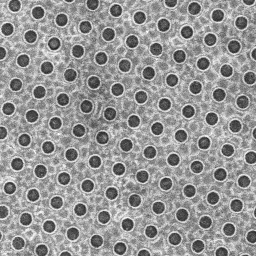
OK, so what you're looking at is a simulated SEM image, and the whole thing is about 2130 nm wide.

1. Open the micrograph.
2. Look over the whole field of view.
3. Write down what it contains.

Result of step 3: a regular array of holes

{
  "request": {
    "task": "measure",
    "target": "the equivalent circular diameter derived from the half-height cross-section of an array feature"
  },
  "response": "111 nanometres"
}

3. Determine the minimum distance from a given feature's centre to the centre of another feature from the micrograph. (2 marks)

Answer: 204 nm